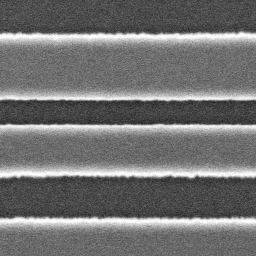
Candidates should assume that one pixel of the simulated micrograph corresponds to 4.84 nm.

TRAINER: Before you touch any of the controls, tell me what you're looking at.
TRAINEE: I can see lines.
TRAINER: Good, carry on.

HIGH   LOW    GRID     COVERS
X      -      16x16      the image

----------------
----------------
XXXXXXXXXXXXXXXX
XXXXXXXXXXXXXXXX
XXXXXXXXXXXXXXXX
XXXXXXXXXXXXXXXX
----------------
----------------
XXXXXXXXXXXXXXXX
XXXXXXXXXXXXXXXX
XXXXXXXXXXXXXXXX
----------------
----------------
----------------
XXXXXXXXXXXXXXXX
XXXXXXXXXXXXXXXX